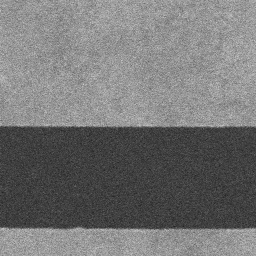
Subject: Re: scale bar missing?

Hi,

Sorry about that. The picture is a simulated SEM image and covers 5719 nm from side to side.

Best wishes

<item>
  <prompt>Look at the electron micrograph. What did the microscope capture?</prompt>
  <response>one or a few lines or trenches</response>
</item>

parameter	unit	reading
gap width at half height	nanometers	2310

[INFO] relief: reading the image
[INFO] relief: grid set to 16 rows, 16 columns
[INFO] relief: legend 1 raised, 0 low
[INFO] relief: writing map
1111111111111111
1111111111111111
1111111111111111
1111111111111111
1111111111111111
1111111111111111
1111111111111111
1111111111111111
0000000000000000
0000000000000000
0000000000000000
0000000000000000
0000000000000000
0000000000000000
1111111111111111
1111111111111111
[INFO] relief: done